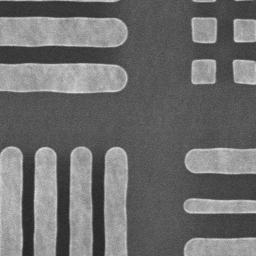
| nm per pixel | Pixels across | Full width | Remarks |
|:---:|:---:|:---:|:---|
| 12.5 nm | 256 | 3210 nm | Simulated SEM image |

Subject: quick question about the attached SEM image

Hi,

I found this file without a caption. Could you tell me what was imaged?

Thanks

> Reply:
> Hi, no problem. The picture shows groups of lines, slits or small figures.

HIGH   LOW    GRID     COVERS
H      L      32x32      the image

LLLLLLLLLLLLLLLLLLLLLLLLLLLLLLLL
LLLLLLLLLLLLLLLLLLLLLLLLLLLLLLLL
HHHHHHHHHHHHHHHLLLLLLLLLHHHLLLLL
HHHHHHHHHHHHHHHHLLLLLLLLHHHLLHHH
HHHHHHHHHHHHHHHHLLLLLLLLHHHLLHHH
HHHHHHHHHHHHHHHLLLLLLLLLLLLLLLLL
LLLLLLLLLLLLLLLLLLLLLLLLLLLLLLLL
LLLLLLLLLLLLLLLLLLLLLLLLLLLLLLLL
HHHHHHHHHHHHHHHLLLLLLLLLHHHLLHHH
HHHHHHHHHHHHHHHHLLLLLLLLHHHLLHHH
HHHHHHHHHHHHHHHHLLLLLLLLLLLLLLLH
LLLLLLLLHHHLLLLLLLLLLLLLLLLLLLLL
LLLLLLLLLLLLLLLLLLLLLLLLLLLLLLLL
LLLLLLLLLLLLLLLLLLLLLLLLLLLLLLLL
LLLLLLLLLLLLLLLLLLLLLLLLLLLLLLLL
LLLLLLLLLLLLLLLLLLLLLLLLLLLLLLLL
LLLLLLLLLLLLLLLLLLLLLLLLLLLLLLLL
LLLLLLLLLLLLLLLLLLLLLLLLLLLLLLLL
LHLLLHLLLLHLLLHLLLLLLLLLLLLLLLLL
HHHLHHHLLHHLLHHHLLLLLLLHHHHHHHHH
HHHLHHHLLHHLLHHHLLLLLLLHHHHHHHHH
HHHLHHHLLHHLLHHHLLLLLLLLHHHHHHHH
HHHLHHHLLHHLLHHHLLLLLLLLLLLLLLLL
HHHLHHHLLHHLLHHHLLLLLLLLLLLLLLLL
HHHLHHHLLHHLLHHHLLLLLLLLLLLLLLLL
HHHLHHHLLHHLLHHHLLLLLLLHHHHHHHHH
HHHLHHHLLHHLLHHHLLLLLLLLHHHHHHHH
HHHLHHHLLHHLLHHHLLLLLLLLLLLLLLLL
HHHLHHHLLHHHLHHHLLLLLLLLLLLLLLLL
HHHLHHHLLHHHLHHHLLLLLLLLLLLLLLLL
HHHLHHHLLHHHLHHHLLLLLLLHHHHHHHHH
HHHLHHHLLHHLLHHHLLLLLLLHHHHHHHHH